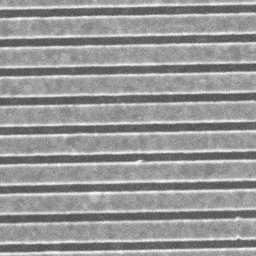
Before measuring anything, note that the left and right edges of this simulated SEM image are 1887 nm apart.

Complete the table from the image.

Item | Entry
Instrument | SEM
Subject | parallel lines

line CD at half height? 0.142 um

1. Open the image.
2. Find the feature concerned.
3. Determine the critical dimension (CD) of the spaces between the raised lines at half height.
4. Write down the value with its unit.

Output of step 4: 74.6 nm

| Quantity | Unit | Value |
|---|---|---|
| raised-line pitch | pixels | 29.3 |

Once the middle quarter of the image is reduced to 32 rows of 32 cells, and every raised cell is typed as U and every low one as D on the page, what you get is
UUDDDDDDDDDDDDDDDDDDDDDDDDDDDDDD
DDDDDDDDDDDDDDDDDDDDDDDDDDDDDDDD
DDDDDDDDDDDDDDDDDDDDDDDDDDDDDDDD
UUUUUUUUUUUUUUUUUUUUUUUUUUUUUUUU
UUUUUUUUUUUUUUUUUUUUUUUUUUUUUUUU
UUUUUUUUUUUUUUUUUUUUUUUUUUUUUUUU
UUUUUUUUUUUUUUUUUUUUUUUUUUUUUUUU
UUUUUUUUUUUUUUUDDDDDDDDDDDDDDDDD
DDDDDDDDDDDDDDDDDDDDDDDDDDDDDDDD
DDDDDDDDDDDDDDDDDDDDDDDDDDDDDDDD
DDDDDUUUUUUUUUUUUUUUUUUUUUUUUUUU
UUUUUUUUUUUUUUUUUUUUUUUUUUUUUUUU
UUUUUUUUUUUUUUUUUUUUUUUUUUUUUUUU
UUUUUUUUUUUUUUUUUUUUUUUUUUUUUUUU
UUUUUUUUUUUUUUUUUUUUUUDDDUUUUDDU
DDDDDDDDDDDDDDDDDDDDDDDDDDDDDDDD
DDDDDDDDDDDDDDDDDDDDDDDDDDDDDDDD
DDDDDDDDDDDDUUDDDDDDDUUUUUUUUUUU
UUUUUUUUUUUUUUUUUUUUUUUUUUUUUUUU
UUUUUUUUUUUUUUUUUUUUUUUUUUUUUUUU
UUUUUUUUUUUUUUUUUUUUUUUUUUUUUUUU
UUUUUUUUUUUUUUUUUUUUUUUUUUUUUUUU
DDDDDDDDDDDDDDDDDDDDDDDDDDDDDDDD
DDDDDDDDDDDDDDDDDDDDDDDDDDDDDDDD
DDDDDDDDDDDDDDDDDDUDDDDDDDDDDDDD
UUUUUUUUUUUUUUUUUUUUUUUUUUUUUUUU
UUUUUUUUUUUUUUUUUUUUUUUUUUUUUUUU
UUUUUUUUUUUUUUUUUUUUUUUUUUUUUUUU
UUUUUUUUUUUUUUUUUUUUUUUUUUUUUUUU
UUUUUUUUUUUUUUUDDDDDDDDDDDDDDDDD
DDDDDDDDDDDDDDDDDDDDDDDDDDDDDDDD
DDDDDDDDDDDDDDDDDDDDDDDDDDDDDDDD